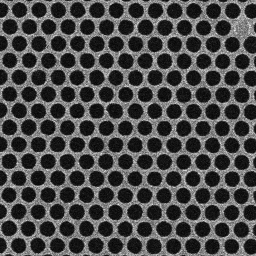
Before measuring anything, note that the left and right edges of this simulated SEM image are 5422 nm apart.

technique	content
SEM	a regular array of holes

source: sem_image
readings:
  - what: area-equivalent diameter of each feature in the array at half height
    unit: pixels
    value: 15.8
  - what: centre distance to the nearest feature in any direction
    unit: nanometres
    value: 401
